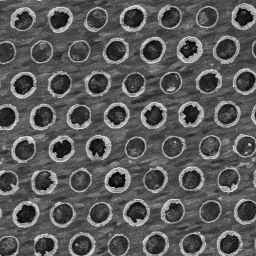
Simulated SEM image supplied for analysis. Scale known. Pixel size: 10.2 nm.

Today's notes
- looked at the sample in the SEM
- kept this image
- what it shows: a regular array of holes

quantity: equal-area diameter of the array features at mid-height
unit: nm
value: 207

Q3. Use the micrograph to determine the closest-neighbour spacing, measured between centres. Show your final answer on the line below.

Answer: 369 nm